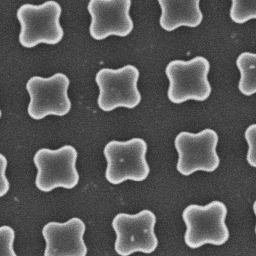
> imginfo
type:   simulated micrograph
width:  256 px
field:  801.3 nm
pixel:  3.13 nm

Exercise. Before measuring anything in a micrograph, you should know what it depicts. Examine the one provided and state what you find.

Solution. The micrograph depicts a regular array of raised bodies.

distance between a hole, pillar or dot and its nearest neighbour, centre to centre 221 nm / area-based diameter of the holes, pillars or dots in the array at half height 136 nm